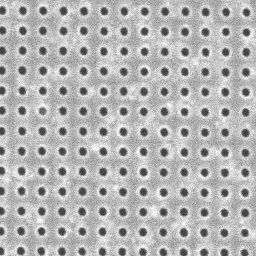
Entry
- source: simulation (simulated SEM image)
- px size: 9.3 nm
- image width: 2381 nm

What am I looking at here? a regular array of holes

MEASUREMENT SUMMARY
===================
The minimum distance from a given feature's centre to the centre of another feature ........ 185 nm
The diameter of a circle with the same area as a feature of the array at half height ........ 77.1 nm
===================